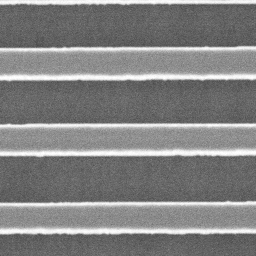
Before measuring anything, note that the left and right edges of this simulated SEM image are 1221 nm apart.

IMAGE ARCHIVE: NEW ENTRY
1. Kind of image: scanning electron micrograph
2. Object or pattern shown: lines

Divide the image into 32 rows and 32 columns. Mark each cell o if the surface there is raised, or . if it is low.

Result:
................................
................................
................................
................................
................................
................................
oooooooooooooooooooooooooooooooo
oooooooooooooooooooooooooooooooo
oooooooooooooooooooooooooooooooo
oooooooooooooooooooooooooooooooo
................................
................................
................................
................................
................................
................................
oooooooooooooooooooooooooooooooo
oooooooooooooooooooooooooooooooo
oooooooooooooooooooooooooooooooo
................................
................................
................................
................................
................................
................................
oooooooooooooooooooooooooooooooo
oooooooooooooooooooooooooooooooo
oooooooooooooooooooooooooooooooo
oooooooooooooooooooooooooooooooo
................................
................................
................................